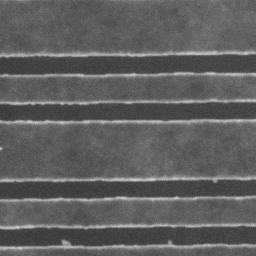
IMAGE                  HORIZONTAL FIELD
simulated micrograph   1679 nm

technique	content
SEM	lines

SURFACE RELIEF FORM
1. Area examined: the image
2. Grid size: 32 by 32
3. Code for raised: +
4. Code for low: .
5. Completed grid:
++++++++++++++++++++++++++++++++
++++++++++++++++++++++++++++++++
++++++++++++++++++++++++++++++++
++++++++++++++++++++++++++++++++
++++++++++++++++++++++++++++++++
++++++++++++++++++++++++++++++++
++++++++++++++++++++++++++++++++
................................
................................
++++++++++++++++++++++++++++++++
++++++++++++++++++++++++++++++++
++++++++++++++++++++++++++++++++
++++++++++++++++++++++++++++++++
................................
................................
++++++++++++++++++++++++++++++++
++++++++++++++++++++++++++++++++
++++++++++++++++++++++++++++++++
++++++++++++++++++++++++++++++++
++++++++++++++++++++++++++++++++
++++++++++++++++++++++++++++++++
++++++++++++++++++++++++++++++++
++++++++++++.+++++..............
................................
................................
++++++++++++++++++++++++++++++++
++++++++++++++++++++++++++++++++
++++++++++++++++++++++++++++++++
++..............................
................................
................................
++++++++++++++++++++++++++++++++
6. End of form